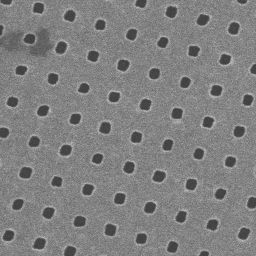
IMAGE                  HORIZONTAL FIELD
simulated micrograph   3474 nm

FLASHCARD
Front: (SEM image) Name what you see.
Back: a regular array of holes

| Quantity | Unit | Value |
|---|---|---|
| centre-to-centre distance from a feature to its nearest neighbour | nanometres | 432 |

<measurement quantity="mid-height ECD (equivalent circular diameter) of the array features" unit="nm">156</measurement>